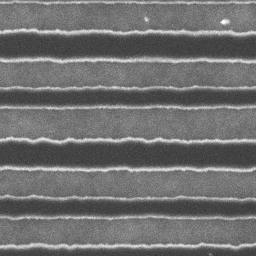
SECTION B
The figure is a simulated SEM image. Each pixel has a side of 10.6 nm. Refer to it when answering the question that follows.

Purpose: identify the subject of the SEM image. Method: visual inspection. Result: lines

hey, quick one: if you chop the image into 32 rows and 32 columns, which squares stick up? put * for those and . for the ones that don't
................................
................................
................................
................................
********************************
********************************
********************************
****..******.****...*****.******
................................
................................
................................
********************************
********************************
......****............***.......
................................
................................
................................
****.*..******.***.**...........
********************************
********************************
********************************
................................
................................
................................
*...*...........................
********************************
********************************
................................
................................
................................
.........................*......
********************************